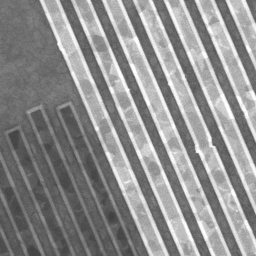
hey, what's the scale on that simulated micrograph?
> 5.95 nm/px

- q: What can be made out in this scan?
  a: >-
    parallel lines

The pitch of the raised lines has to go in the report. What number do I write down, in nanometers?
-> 169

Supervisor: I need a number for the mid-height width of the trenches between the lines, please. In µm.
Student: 0.0868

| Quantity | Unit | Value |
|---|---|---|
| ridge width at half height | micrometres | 0.0868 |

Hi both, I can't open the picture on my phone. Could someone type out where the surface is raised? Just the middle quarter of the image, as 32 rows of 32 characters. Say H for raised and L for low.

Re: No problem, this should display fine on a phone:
LHHHHLLLLHHHHLLLLHHHHLLLLHHHHLLL
LLHHHHLLLLHHHHLLLHHHHLLLLHHHHLLL
LLHHHHLLLLHHHHLLLLHHHHLLLLHHHLLL
LLLHHHHLLLLHHHLLLLHHHHLLLLHHHHLL
LLLHHHHLLLLHHHHLLLLHHHHLLLHHHHLL
LLLLHHHLLLLHHHHLLLLHHHHLLLLHHHHL
LLLLHHHHLLLLHHHHLLLLHHHLLLLHHHHL
LLLLLHHHLLLLHHHHLLLLHHHHLLLLHHHH
LLLLLHHHHLLLLHHHHLLLHHHHLLLLHHHH
LLLLLHHHHLLLLHHHHLLLLHHHHLLLLHHH
HHLLLLHHHHLLLLHHHLLLLHHHHLLLLHHH
HHLLLLHHHHLLLLHHHHLLLLHHHHLLLHHH
HHHLLLLHHHLLLLHHHHLLLLHHHHLLLLHH
HHHLLLLHHHHLLLLHHHHLLLLHHHLLLLLH
HHHHLLLLHHHLLLLHHHHLLLLHHHHLLLLH
HHHHLLLLHHHHLLLLHHHHLLLHHHHLLLLH
LHHHLLLLHHHHLLLLHHHHLLLLHHHHLLLL
LHHHHLLLLHHHHLLLLHHHHLLLHHHHLLLL
LHHHHLLLLHHHHLLLLHHHHLLLLHHHHLLL
LLHHHHLLLLHHHLLLLHHHHLLLLHHHHLLL
LLHHHHLLLLHHHHLLLLHHHHLLLLHHHHLL
LLLHHHHLLLLHHHLLLLHHHHLLLLHHHHLL
LLLHHHHLLLLHHHHLLLLHHHHLLLHHHHLL
LLLLHHHLLLLHHHHLLLLHHHHLLLLHHHHL
LLLLHHHHLLLLHHHHLLLLHHHHLLLHHHHL
HLLLLHHHLLLLHHHHLLLLHHHHLLLLHHHH
HLLLLHHHHLLLLHHHLLLLHHHHLLLLHHHH
HLLLLHHHHLLLLHHHHLLLLHHHHLLLLHHH
HHLLLLHHHHLLLLHHHLLLLHHHHLLLLHHH
HHLLLLHHHHLLLLHHHHLLLLHHHHLLLHHH
HHHLLLLHHHLLLLHHHHLLLLHHHHLLLLHH
HHHLLLLHHHHLLLLHHHHLLLLHHHHLLLHH